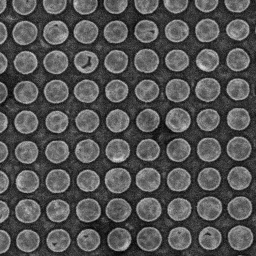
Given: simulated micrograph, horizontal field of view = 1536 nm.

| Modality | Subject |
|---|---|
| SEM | a regular array of raised bodies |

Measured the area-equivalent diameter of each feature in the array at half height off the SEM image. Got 138 nm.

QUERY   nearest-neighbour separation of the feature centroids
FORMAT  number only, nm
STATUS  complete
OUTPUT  178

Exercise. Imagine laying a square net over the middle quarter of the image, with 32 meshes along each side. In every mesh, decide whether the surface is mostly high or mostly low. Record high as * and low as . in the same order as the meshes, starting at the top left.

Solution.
*..*...*..******..*****...*****.
....****...****....****....**...
................................
................................
....***.....**.....****...****..
*..*****...*****..*****...*****.
*..******.******..******..*****.
*..******..*****..*****...*****.
*..*****...****....****...*****.
.....**.........................
................................
.....**......*......**.....***..
....****...*****...****...*****.
*..******..*****..******..******
*..******..*****..******..******
*..*****...*****..*****...*****.
....****....***.....**.....***..
................................
................................
....****....***....****....****.
*..******..*****..******..*****.
*..*.****..*****..******..*****.
*..******..*****..******..*****.
*..*****...*****...****....***..
.....*......**..................
................................
............***.....***....***..
*...****...*****...*****..*****.
*..******.******..******..******
*..******.******..******..******
*...****...*****..******..*****.
.....**.....****....**.....***..